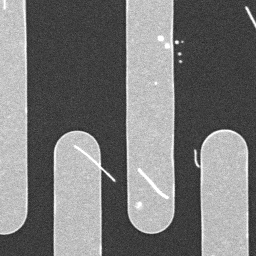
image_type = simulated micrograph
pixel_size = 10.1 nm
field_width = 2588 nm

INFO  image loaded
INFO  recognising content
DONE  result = groups of lines, slits or small figures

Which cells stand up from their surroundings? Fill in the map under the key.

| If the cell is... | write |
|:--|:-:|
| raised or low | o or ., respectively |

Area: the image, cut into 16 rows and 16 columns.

oo......ooo.....
oo......ooo.....
oo......ooo.....
oo......ooo.....
oo......ooo.....
oo......ooo.....
oo......ooo.....
oo......ooo.....
oo..oo..ooo..oo.
oo.ooo..ooo..oo.
oo.ooo..ooo..oo.
oo.ooo..ooo..oo.
oo.ooo..ooo..oo.
oo.ooo..ooo..oo.
o..ooo...o...oo.
...ooo.......oo.